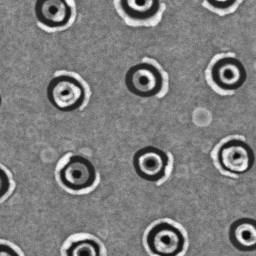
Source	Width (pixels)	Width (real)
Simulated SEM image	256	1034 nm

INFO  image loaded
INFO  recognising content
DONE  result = ring-shaped grooves with a dot in the middle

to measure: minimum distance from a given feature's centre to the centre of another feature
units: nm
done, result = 321